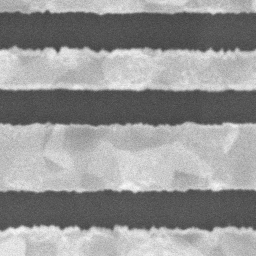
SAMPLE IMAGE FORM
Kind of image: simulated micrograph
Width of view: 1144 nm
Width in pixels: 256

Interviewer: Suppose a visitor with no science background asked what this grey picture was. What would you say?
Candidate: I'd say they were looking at lines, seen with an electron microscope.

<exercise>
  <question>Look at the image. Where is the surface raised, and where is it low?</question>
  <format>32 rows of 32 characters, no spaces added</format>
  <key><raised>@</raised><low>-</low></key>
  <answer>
@@@@@@@@@@@@@@@@@@@@@@@@@@@@@@@@
-@@@--@@--@@@@@@@@@@@@@@@@@@@@@@
--------------------------------
--------------------------------
--------------------------------
--------------------------------
@@@@@@@@@@@@--@@@@@@-@@@@-@@-@--
@@@@@@@@@@@@@@@@@@@@@@@@@@@@@@@@
@@@@@@@@@@@@@@@@@@@@@@@@@@@@@@@@
@@@@@@@@@@@@@@@@@@@@@@@@@@@@@@@@
@@@@@@@@@@@@@@@@@@@@@@@@@@@@@@@@
--------------------------------
--------------------------------
--------------------------------
--------------------------------
----@------------------@@---@---
@@@@@@@@@@@@@@@@@@@@@@@@@@@@@@@@
@@@@@@@@@@@@@@@@@@@@@@@@@@@@@@@@
@@@@@@@@@@@@@@@@@@@@@@@@@@@@@@@@
@@@@@@@@@@@@@@@@@@@@@@@@@@@@@@@@
@@@@@@@@@@@@@@@@@@@@@@@@@@@@@@@@
@@@@@@@@@@@@@@@@@@@@@@@@@@@@@@@@
@@@@@@@@@@@@@@@@@@@@@@@@@@@@@@@@
@@@@@@@@@@@@@@@@@@@@@@@@@@@@@@@@
--------------------------------
--------------------------------
--------------------------------
--------------------------------
--@-@@@--@----@@------------@---
@@@@@@@@@@@@@@@@@@@@@@@@@@@@@@@@
@@@@@@@@@@@@@@@@@@@@@@@@@@@@@@@@
@@@@@@@@@@@@@@@@@@@@@@@@@@@@@@@@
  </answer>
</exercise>